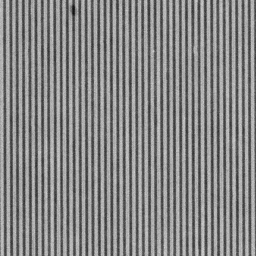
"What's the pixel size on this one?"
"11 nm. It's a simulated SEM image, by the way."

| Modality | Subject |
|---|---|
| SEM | parallel lines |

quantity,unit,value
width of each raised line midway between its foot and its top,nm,26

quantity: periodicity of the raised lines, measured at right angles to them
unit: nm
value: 68.8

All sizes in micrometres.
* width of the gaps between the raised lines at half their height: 0.0452